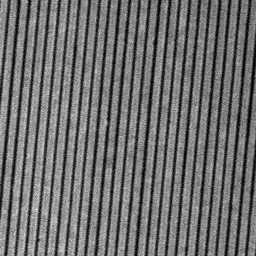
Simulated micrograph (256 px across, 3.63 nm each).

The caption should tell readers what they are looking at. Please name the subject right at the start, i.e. parallel lines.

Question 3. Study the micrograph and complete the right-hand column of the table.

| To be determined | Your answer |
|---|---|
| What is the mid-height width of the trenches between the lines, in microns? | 0.0135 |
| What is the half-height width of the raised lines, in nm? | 23.5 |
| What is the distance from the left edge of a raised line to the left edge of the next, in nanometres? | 36.2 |